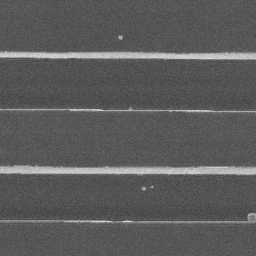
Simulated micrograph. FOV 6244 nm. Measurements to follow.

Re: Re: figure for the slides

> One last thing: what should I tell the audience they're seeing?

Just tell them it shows lines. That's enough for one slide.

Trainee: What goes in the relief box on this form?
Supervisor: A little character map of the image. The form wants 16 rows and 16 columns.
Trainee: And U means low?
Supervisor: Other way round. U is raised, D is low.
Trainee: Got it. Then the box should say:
UUUUUUUUUUUUUUUU
UUUUUUUUUUUUUUUU
UUUUUUUUUUUUUUUU
DDDUUUUUUUUUUUUU
DDDDDDDDDDDDDDDD
DDDDDDDDDDDDDDDD
DDDDDDDDDDDDDDDD
UUUUUUUUUUUUUUUU
UUUUUUUUUUUUUUUU
UUUUUUUUUUUUUUUU
UUUUUUUUUUUUUUUU
DDDDDDDDDDDDDDDD
DDDDDDDDDDDDDDDD
DDDDDDDDDDDDDDDD
UUUUUUUUUUUUUUUU
UUUUUUUUUUUUUUUU